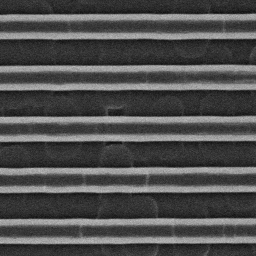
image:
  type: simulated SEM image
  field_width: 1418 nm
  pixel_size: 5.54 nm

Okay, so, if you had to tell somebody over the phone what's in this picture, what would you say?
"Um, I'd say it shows wiring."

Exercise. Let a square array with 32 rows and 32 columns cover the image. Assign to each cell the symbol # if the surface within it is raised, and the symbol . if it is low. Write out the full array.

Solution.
................................
................................
################################
################################
....................####........
................................
................................
................................
................................
################################
################################
................................
................................
................................
................................
################################
################################
................................
................................
................................
................................
################################
################################
################################
................................
................................
................................
................................
################################
################################
................................
................................